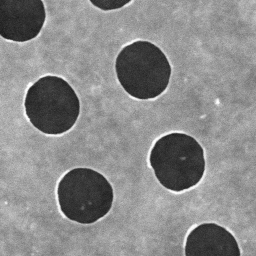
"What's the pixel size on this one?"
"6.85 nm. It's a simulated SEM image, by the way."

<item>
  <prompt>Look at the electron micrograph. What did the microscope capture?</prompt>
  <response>holes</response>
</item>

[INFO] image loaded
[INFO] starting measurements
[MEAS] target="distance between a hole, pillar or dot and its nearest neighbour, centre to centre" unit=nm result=664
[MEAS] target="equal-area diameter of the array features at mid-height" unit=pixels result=56.2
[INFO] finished